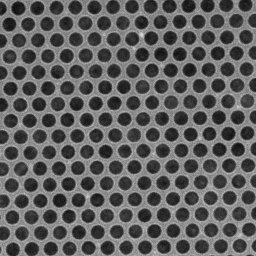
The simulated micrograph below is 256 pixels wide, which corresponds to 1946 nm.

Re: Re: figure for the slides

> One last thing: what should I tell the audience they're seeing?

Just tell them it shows a regular array of holes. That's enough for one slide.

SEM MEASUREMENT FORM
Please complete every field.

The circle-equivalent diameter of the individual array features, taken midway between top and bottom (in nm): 112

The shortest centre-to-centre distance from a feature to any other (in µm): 0.14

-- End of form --